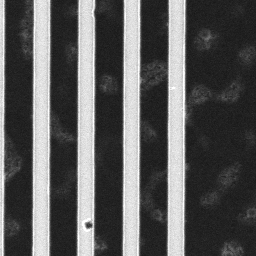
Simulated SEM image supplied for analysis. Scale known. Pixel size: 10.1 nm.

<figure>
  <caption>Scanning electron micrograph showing parallel lines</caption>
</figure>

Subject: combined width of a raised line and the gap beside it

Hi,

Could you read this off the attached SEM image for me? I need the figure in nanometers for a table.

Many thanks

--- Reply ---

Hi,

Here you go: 457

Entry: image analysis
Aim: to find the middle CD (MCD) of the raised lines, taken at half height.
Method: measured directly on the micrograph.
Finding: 0.32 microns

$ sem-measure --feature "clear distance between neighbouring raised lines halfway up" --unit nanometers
142